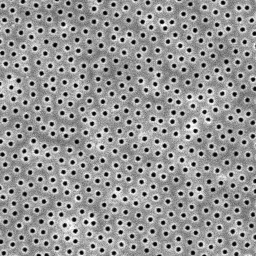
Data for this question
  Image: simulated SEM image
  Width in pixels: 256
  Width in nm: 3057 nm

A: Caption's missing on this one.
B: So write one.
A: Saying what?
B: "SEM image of a regular array of holes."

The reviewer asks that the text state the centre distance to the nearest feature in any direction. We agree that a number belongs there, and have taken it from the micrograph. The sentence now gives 126 nm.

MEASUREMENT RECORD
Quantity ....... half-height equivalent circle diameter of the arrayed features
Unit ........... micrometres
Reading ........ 0.0539